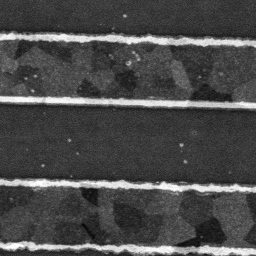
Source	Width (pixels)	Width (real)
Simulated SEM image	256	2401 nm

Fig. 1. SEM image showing one or a few lines or trenches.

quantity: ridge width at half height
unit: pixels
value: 63.1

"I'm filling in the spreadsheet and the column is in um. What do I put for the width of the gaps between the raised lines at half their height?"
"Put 0.78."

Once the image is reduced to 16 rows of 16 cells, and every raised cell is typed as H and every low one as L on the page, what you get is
LLLLLLLLLLLLLLLL
LLLLLLLLLLLLLLLL
HHHHHHHHLHLLLLLL
HHHHHHHHHHHHHHHH
HHHHHHHHHHHHHHHH
HHHHHHHHHHHHHHHH
LLLLLLLLLLLHHHHH
LLLLLLLLLLLLLLLL
LLLLLLLLLLLLLLLL
LLLLLLLLLLLLLLLL
LLLLLLLLLLLLLLLL
HHHHHLLLLLLLLLLL
HHHHHHHHHHHHHHHH
HHHHHHHHHHHHHHHH
HHHHHHHHHHHHHHHH
LLLLLLLHHHHHHHHH